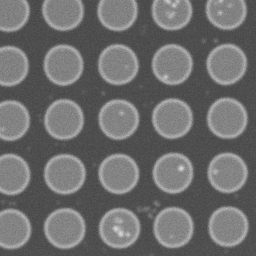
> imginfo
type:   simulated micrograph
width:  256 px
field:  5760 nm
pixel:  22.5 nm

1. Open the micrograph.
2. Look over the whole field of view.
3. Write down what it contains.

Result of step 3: an array of small figures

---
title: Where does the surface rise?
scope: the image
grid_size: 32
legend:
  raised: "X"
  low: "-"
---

XXX---XXXX--XXXXX--XXXXX--XXXXX-
XXXX-XXXXX--XXXXX--XXXXX--XXXXX-
XXX---XXXX---XXXX--XXXXX--XXXX--
XX-----XX-----XX----XX------X---
--------------------------------
--------------------------------
XXX---XXXX---XXXX---XXX----XXX--
XXX---XXXX--XXXXX--XXXXX--XXXXX-
XXX---XXXX--XXXXX--XXXXX--XXXXX-
XXX---XXXX---XXXX---XXX---XXXX--
XX-----X------X-------------X---
--------------------------------
---------------------X-----XX---
XXX---XXXX---XXXX--XXXXX--XXXX--
XXXX--XXXX--XXXXX--XXXXX--XXXXX-
XXXX--XXXX---XXXX--XXXXX--XXXXX-
XXX---XXXX---XXXX---XXX----XXX--
-X------------------------------
--------------------------------
XX-----XX-----XX-----XX----XXX--
XXX---XXXX---XXXX--XXXXX--XXXXX-
XXXX--XXXXX-XXXXX--XXXXX--XXXXX-
XXXX--XXXX---XXXX--XXXXX--XXXXX-
XXX---XXXX---XXX----XXX----XXX--
--------------------------------
--------------------------------
XX-----XXX----XX----XXX----XXX--
XXX---XXXX---XXXX--XXXXX--XXXXX-
XXXX--XXXXX--XXXX--XXXXX--XXXXX-
XXXX--XXXX---XXXX--XXXXX--XXXXX-
XXX----XXX---XXX----XXX----XXX--
--------------------------------